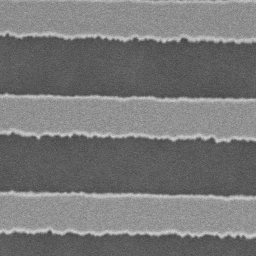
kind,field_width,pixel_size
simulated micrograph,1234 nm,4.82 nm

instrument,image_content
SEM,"lines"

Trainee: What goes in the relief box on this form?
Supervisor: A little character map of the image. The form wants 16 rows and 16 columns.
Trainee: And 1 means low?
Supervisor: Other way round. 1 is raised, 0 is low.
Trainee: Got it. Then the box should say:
1111111111111111
1111111111111111
0000000100101111
0000000000000000
0000000000000000
0000000000000000
1111111111111111
1111111111111111
0000001101111111
0000000000000000
0000000000000000
0000000000000000
1111111111111111
1111111111111111
1011111111111111
0000000000000000